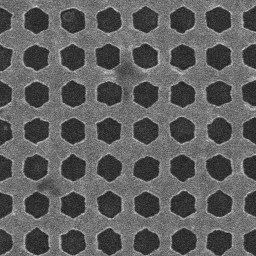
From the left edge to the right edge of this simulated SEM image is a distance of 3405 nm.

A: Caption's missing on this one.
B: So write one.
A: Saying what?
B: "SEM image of a regular array of holes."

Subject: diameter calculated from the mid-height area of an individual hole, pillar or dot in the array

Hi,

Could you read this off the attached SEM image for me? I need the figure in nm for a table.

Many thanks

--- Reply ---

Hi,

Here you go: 345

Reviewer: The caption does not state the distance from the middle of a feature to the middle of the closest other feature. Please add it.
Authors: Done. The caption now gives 481 nm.